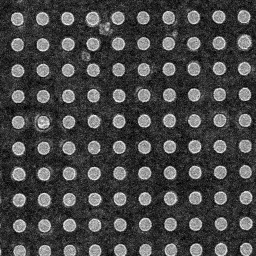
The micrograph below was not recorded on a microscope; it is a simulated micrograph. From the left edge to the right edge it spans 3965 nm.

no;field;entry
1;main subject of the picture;a regular array of raised bodies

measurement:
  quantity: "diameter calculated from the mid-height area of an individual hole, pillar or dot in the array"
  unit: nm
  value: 189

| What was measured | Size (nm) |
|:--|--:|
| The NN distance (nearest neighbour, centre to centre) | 388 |